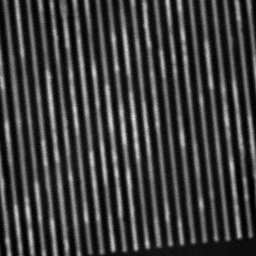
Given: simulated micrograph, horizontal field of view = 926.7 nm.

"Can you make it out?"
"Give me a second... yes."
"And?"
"parallel lines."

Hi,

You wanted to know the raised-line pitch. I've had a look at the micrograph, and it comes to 0.0418 um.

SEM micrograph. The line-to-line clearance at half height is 7.96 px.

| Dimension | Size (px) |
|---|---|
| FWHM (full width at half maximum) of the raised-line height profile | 2.98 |